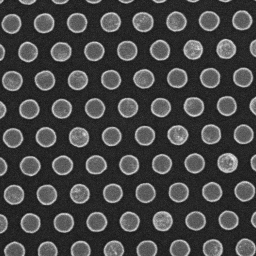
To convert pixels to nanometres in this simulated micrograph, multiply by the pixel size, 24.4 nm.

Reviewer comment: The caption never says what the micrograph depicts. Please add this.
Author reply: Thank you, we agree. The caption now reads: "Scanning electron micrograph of a regular array of raised bodies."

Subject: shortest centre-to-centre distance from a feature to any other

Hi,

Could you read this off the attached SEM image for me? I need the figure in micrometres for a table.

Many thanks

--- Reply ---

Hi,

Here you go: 0.794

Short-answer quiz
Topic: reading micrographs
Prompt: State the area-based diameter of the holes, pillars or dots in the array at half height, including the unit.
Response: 475 nm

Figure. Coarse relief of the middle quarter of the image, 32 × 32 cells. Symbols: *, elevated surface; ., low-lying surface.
................................
...........................**...
..***.....****....****....****..
.*****....****....****....*****.
.*****....****....****....*****.
..***.....****.....***.....***..
................................
................................
...............................*
*.....***.....****....****....**
**....****....****....****....**
**....****....****....****....**
*.....****....****.....***.....*
.......**.......................
................................
............................*...
..***.....****....****....*****.
..****....****....*****...*****.
..****....****....*****...*****.
..****....****.....***.....***..
...**...........................
................................
................................
*......***.....***.....***.....*
**....****....****....*****...**
**....****....****....*****...**
**....****....****.....***.....*
*...............*...............
................................
................................
...**......***.....***.....***..
..****....****....****....*****.